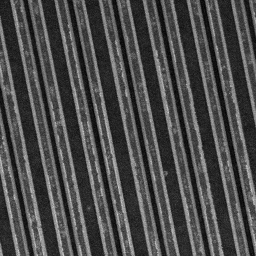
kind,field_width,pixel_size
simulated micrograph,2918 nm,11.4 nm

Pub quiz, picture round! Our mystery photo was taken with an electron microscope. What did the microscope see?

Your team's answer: parallel lines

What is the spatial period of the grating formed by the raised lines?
0.246 um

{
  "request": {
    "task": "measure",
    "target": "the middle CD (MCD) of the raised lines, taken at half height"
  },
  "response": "110 nanometers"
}